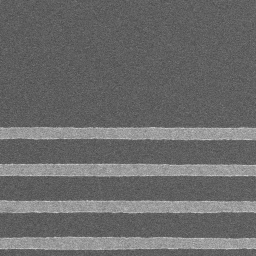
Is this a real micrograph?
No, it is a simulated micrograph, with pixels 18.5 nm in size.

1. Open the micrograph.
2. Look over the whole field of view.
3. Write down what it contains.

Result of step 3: parallel lines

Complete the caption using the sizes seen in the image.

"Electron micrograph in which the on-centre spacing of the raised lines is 679 nm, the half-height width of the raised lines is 209 nanometers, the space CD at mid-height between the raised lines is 0.473 µm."